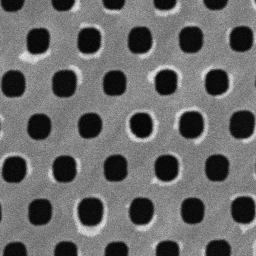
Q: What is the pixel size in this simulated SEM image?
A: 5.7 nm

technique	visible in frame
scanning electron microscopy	a regular array of holes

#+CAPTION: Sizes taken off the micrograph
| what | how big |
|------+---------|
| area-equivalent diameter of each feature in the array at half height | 26.3 pixels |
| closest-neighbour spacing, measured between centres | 49.5 px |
